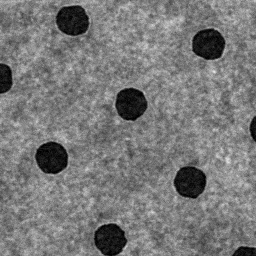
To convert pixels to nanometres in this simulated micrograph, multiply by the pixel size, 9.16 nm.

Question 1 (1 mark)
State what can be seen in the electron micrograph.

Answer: holes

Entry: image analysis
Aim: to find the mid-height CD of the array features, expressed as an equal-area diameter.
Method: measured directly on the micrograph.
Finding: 306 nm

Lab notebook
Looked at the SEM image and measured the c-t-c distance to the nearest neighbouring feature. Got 898 nm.